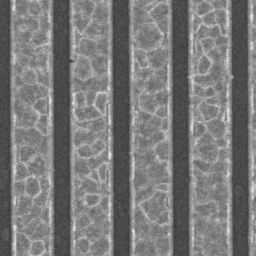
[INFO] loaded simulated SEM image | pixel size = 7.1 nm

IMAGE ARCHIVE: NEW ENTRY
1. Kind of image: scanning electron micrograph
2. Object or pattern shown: parallel lines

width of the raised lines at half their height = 280 nanometers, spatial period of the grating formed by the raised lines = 422 nm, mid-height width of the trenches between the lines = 0.14 micrometres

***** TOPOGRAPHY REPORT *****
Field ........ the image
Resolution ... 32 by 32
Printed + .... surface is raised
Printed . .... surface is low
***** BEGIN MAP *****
..++++...+++++..+++++...+++++..+
..++++...+++++..+++++...+++++..+
..++++...+++++..+++++...+++++..+
..++++...+++++..+++++...+++++..+
..++++...+++++..+++++...+++++..+
..++++...+++++..+++++...+++++..+
..++++...+++++..+++++...+++++..+
..++++...+++++..+++++...+++++..+
..++++...+++++..+++++...+++++..+
..++++...+++++..+++++...+++++..+
..++++...+++++..+++++...+++++..+
..++++...+++++..+++++...+++++..+
..++++...+++++..+++++...+++++..+
..++++...+++++..+++++...+++++..+
..++++...+++++..+++++...+++++..+
..++++...+++++...++++...+++++..+
..++++...+++++...++++...+++++..+
..++++...+++++...++++...+++++..+
..++++...+++++...++++...+++++..+
..++++...+++++..+++++...+++++..+
..++++...+++++...++++...+++++..+
..++++...+++++...++++...+++++..+
..++++...+++++..+++++...+++++..+
..++++...+++++..+++++...+++++..+
..++++...+++++...++++...+++++..+
..++++...+++++...++++...+++++..+
..++++...+++++...++++...+++++..+
..++++...+++++...++++...+++++..+
..++++...+++++...++++...+++++..+
..++++...+++++...++++...+++++..+
..++++...+++++...++++...+++++..+
..++++...+++++...++++...+++++..+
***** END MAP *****